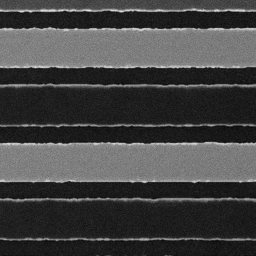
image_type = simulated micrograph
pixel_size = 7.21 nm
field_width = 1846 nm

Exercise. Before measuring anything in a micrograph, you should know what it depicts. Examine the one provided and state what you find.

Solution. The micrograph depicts lines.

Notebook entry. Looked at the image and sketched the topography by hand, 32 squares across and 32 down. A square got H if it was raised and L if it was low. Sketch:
HHHHHHHHHHHHHHHHHHHHHHHHHHHHHHHH
LLLLLLLLLLLLLLLLLLLLLLLLLLLLLLLL
LLLLLLLLLLLLLLLLLLLLLLLLLLLLLLLL
LLLLLLHLLLLLLLLLLLLLLLLLLLLLLLLL
HHHHHHHHHHHHHHHHHHHHHHHHHHHHHHHH
HHHHHHHHHHHHHHHHHHHHHHHHHHHHHHHH
HHHHHHHHHHHHHHHHHHHHHHHHHHHHHHHH
HHHHHHHHHHHHHHHHHHHHHHHHHHHHHHHH
LLLLLLLLLLLLLLLLLLLLLLLLLLLLLLLL
LLLLLLLLLLLLLLLLLLLLLLLLLLLLLLLL
LLLLLLLLLLLLLLLLLLLLLLLLLLLLLLLL
HHHHHHHHHHHHHHHHHHHHHHHHHHHHHHHH
HHHHHHHHHHHHHHHHHHHHHHHHHHHHHHHH
HHHHHHHHHHHHHHHHHHHHHHHHHHHHHHHH
HHHHHHHHHHHHHHHHHHHHHHHHHHHHHHHH
HHHHHHHHHHHHHHHHHHHHHHHHHHHHHHHH
LLLLLLLLLLLLLLLLLLLLLLLLLLLLLLLL
LLLLLLLLLLLLLLLLLLLLLLLLLLLLLLLL
HHHHHHHHHHHHHHHHHHHHHHHHHHHHHHHH
HHHHHHHHHHHHHHHHHHHHHHHHHHHHHHHH
HHHHHHHHHHHHHHHHHHHHHHHHHHHHHHHH
HHHHHHHHHHHHHHHHHHHHHHHHHHHHHHHH
HHHHHHHHHHHHHHHHHHHHHHHHHHHHHHHH
LLLLLLLLLLLLLLLLLLLLLLLLLLLLLLLL
LLLLLLLLLLLLLLLLLLLLLLLLLLLLLLLL
HHHHHHHHHHHHHHHHHHHHHHHHHHHHHHHH
HHHHHHHHHHHHHHHHHHHHHHHHHHHHHHHH
HHHHHHHHHHHHHHHHHHHHHHHHHHHHHHHH
HHHHHHHHHHHHHHHHHHHHHHHHHHHHHHHH
HHHHHHHHHHHHHHHHHHHHHHHHHHHHHHHH
LLLLLLLLLLLLLLLLLLLLLLLLLLLLLLLL
LLLLLLLLLLLLLLLLLLLLLLLLLLLLLLLL